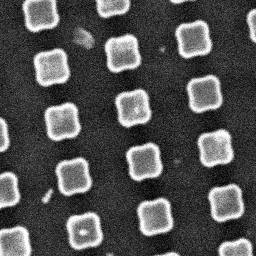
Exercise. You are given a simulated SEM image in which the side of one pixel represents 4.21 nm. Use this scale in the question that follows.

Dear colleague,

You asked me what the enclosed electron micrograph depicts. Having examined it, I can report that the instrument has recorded a regular array of raised bodies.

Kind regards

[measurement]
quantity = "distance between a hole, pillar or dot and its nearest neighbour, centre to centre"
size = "234 nm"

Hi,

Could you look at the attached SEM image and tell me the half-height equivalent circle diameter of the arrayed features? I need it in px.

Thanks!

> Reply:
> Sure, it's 34.6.